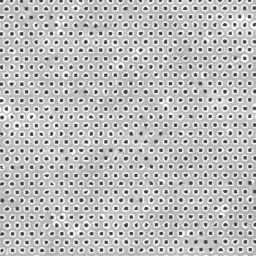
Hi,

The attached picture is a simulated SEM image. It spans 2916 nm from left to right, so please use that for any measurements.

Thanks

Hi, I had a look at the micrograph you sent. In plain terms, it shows a regular array of holes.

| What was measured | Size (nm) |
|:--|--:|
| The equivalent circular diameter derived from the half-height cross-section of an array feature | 51.4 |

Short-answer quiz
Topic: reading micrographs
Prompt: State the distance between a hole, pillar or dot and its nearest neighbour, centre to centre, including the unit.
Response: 9.2 px